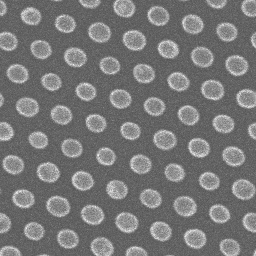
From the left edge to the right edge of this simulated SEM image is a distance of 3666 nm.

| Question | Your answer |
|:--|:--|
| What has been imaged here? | a regular array of raised bodies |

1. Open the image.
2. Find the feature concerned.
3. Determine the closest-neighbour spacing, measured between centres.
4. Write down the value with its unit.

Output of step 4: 488 nm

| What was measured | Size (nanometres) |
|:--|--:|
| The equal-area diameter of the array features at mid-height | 283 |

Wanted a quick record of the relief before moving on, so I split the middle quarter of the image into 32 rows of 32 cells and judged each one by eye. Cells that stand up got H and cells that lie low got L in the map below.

LLHHLLLLLHHHHHLLLLHHHLLLLLLLLLLL
LLLLLLLLLLHHHHLLLHHHHHLLLLLLLLLL
LLLLLLLLLLLHLLLLLHHHHHHLLLLHHHLL
LLLLLLLLLLLLLLLLLLHHHHLLLLHHHHHL
LLLLLLLLLLLLLLLLLLLHHLLLLLHHHHHL
LLLHHHHLLLLLLLLLLLLLLLLLLLLHHHHL
LLLHHHHHLLLLLHHLLLLLLLLLLLLLHHLL
LLLHHHHHLLLLHHHHLLLLLLLLLLLLLLLL
LLLLHHHLLLLHHHHHHLLLLLHLLLLLLLLL
LLLLLLLLLLLLHHHHHLLLHHHHHLLLLLLL
LLLLLLLLLLLLLHHHLLLLHHHHHLLLLLLL
HLLLLLLLLLLLLLLLLLLLHHHHHLLLLHHH
HHLLLLLLLLLLLLLLLLLLLLHHLLLLLHHH
HHLLLLHHHHLLLLLLLLLLLLLLLLLLLHHH
HLLLLLHHHHLLLLLLLLLLLLLLLLLLLLHH
LLLLLLHHHHLLLLHHHHLLLLLLLLLLLLLL
LLLLLLLHHHLLLLHHHHHLLLLLLLLLLLLL
LLLLLLLLLLLLLLHHHHHLLLLHHHHLLLLL
LLLLLLLLLLLLLLLHHHLLLLHHHHHHLLLL
HHHLLLLLLLLLLLLLLLLLLLLHHHHHLLLH
HHHHLLLLLLLLLLLLLLLLLLLHHHHHLLLH
HHHHLLLLLHHHLLLLLLLLLLLLLLLLLLLH
HHHHLLLLHHHHHLLLLLLLLLLLLLLLLLLL
LLLLLLLLHHHHHLLLLHHHHLLLLLLLLLLL
LLLLLLLLLHHHLLLLLHHHHHLLLLLLLLLL
LLLLLLLLLLLLLLLLLHHHHHLLLLHHHLLL
LLLLLLLLLLLLLLLLLHHHHLLLLHHHHHLL
LLLHHHLLLLLLLLLLLLLLLLLLLHHHHHLL
LLHHHHHLLLLLLLLLLLLLLLLLLLHHHHLL
LLHHHHHLLLLLHHLLLLLLLLLLLLLLLLLL
LLLHHHHLLLLHHHHLLLLLLLLLLLLLLLLL
LLLLHLLLLLLHHHHHLLLLLHLLLLLLLLLL